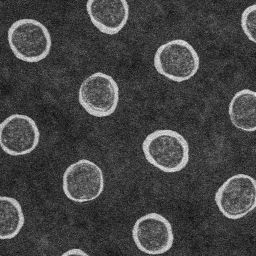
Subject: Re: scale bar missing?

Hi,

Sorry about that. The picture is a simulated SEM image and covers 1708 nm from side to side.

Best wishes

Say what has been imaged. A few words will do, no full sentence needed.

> raised bodies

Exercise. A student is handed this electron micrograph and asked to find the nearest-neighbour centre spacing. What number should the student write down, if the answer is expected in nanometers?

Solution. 567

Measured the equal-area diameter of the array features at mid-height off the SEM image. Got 255 nm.